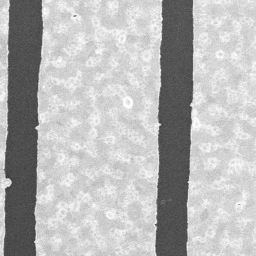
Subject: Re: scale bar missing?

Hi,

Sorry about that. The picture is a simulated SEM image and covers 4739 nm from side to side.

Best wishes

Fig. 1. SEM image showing one or a few lines or trenches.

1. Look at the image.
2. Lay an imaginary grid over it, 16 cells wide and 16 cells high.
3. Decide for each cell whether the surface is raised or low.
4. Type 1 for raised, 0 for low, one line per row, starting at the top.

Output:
1001111111001111
1001111111001111
0001111111001111
0001111111001111
0011111111001111
0011111111001111
0011111111001111
0011111111001111
0011111111001111
0011111111001111
0011111111001111
1011111111001111
0011111111001111
0011111111001111
0011111111001111
0011111111001111